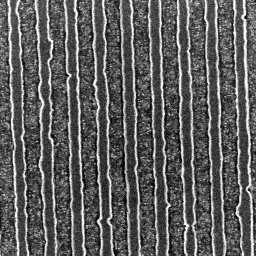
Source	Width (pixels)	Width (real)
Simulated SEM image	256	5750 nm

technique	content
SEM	parallel lines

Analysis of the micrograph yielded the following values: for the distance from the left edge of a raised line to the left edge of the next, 28.1 px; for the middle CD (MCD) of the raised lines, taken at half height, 247 nm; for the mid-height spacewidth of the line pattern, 393 nm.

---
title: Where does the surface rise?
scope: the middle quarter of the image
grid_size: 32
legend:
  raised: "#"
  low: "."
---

.##.....##.....##.....##.....##.
.##.....##.....###....##.....##.
.##.....##.....###....##.....###
.###....##.....###....###....###
.###....##.....###....###....###
.##.....###....###....###....###
.##.....###....###....###....###
.##.....###....###....###....###
.##.....###....###....###....###
.###....###....###....###....###
.###....###....###....###....###
.###....###....###....###....###
.###....###....###....###....###
.###....###....###....###....###
.###....###....###....###....###
.###.....##....###....###....###
.###....###....###....###....###
.###....###....###....###....###
.###....###....###....###....###
..##....###....###.....##....###
..##....###....###.....##....###
..##.....##....###.....##....###
..##....###....###.....##.....##
..##....###....###....###.....##
.###.....##....###.....##.....##
.###.....##....###.....##.....##
.###....###....###.....##.....##
..##.....##....###.....##....###
..##.....##....###.....##....###
..##.....###...###.....##.....##
..###....###....###....###....##
..##.....###....###....###....##